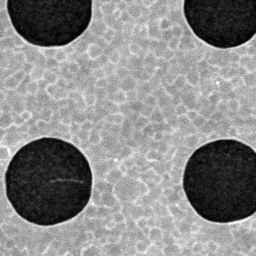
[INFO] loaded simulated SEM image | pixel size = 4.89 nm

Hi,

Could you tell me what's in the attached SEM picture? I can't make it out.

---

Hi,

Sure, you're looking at holes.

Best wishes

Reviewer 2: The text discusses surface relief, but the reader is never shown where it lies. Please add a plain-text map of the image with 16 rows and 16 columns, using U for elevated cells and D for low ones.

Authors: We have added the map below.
DDDDDDUUUUUDDDDD
UDDDDDUUUUUUDDDD
UUDDDUUUUUUUUDDD
UUUUUUUUUUUUUUUU
UUUUUUUUUUUUUUUU
UUUUUUUUUUUUUUUU
UUUUUUUUUUUUUUUU
UUUUUUUUUUUUUUUU
UUUUUUUUUUUUUUUU
UDDDDUUUUUUUDDDD
DDDDDDUUUUUUDDDD
DDDDDDUUUUUDDDDD
UDDDDDUUUUUUDDDD
UDDDDUUUUUUUUDDD
UUUUUUUUUUUUUUUU
UUUUUUUUUUUUUUUU